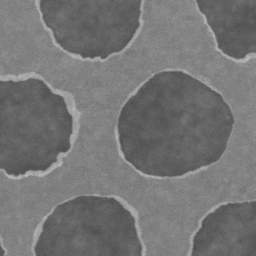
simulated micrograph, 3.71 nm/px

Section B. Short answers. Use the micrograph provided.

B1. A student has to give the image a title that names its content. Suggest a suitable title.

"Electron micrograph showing holes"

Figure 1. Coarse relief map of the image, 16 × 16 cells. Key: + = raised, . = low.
++.......+++....
+++......++++...
+++.....++++++..
+++++..+++++++.+
++++++++++.+++++
...++++++....+++
....++++......++
.....++........+
.....++.......++
....++++......++
...+++++.....+++
++++++++++++++++
++++...+++++++++
+++.....+++++...
++.......+++....
++.......+++....